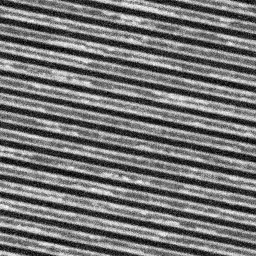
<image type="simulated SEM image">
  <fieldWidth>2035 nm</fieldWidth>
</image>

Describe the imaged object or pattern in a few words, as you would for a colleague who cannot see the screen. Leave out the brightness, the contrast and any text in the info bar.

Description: parallel lines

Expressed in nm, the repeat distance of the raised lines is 136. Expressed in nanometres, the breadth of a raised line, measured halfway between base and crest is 73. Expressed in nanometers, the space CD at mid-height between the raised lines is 66.1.